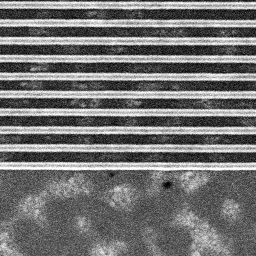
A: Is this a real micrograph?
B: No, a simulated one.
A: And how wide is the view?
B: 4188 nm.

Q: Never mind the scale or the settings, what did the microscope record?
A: parallel lines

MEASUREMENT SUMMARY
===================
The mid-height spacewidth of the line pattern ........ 194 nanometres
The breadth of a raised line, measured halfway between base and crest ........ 0.102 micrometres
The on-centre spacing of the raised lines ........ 292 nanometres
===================